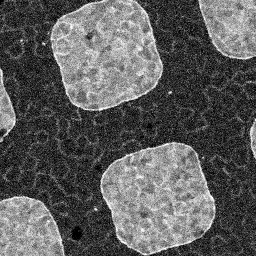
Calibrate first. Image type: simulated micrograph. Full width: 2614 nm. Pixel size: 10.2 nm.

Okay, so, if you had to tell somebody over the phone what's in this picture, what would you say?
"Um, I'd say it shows raised bodies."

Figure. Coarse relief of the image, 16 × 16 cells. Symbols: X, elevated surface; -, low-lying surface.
-----XXXX----XXX
----XXXXX----XXX
---XXXXXXX---XXX
---XXXXXXX----XX
----XXXXXX------
----XXXXX-------
X----XX---------
X---------------
----------------
---------XXX----
-------XXXXXX---
------XXXXXXX---
XX-----XXXXXX---
XXX----XXXXXX---
XXXX---XXXXXX---
XXXX----XXX-----